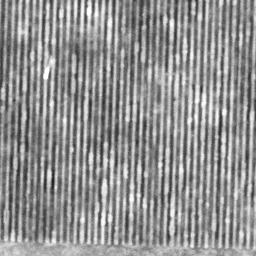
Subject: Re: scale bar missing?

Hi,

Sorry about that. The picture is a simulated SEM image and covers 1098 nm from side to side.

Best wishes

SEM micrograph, parallel lines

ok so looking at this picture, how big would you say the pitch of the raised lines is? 29.7 nm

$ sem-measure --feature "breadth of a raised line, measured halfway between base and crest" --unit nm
10.7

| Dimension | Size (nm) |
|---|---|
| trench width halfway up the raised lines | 18.2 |